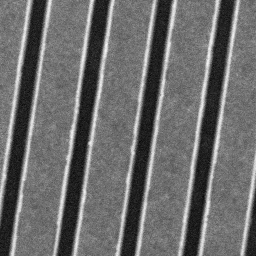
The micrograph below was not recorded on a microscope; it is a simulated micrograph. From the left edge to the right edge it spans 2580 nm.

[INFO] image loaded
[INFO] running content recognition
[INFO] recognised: parallel lines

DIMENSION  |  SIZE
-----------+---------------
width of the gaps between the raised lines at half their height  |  203 nanometres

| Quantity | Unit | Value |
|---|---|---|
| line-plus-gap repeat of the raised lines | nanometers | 624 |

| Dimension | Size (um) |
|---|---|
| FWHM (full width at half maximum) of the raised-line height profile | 0.425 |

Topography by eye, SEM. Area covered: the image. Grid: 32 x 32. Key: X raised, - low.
XXXX--XXXXX---XXXXX---XXXXX---XX
XXXX--XXXXX---XXXXX---XXXXX---XX
XXX---XXXXX---XXXXX--XXXXXX--XXX
XXX---XXXXX---XXXXX--XXXXXX--XXX
XXX---XXXXX--XXXXXX--XXXXXX--XXX
XXX--XXXXXX--XXXXXX--XXXXX---XXX
XXX--XXXXXX--XXXXX---XXXXX---XXX
XXX--XXXXX---XXXXX---XXXXX---XXX
XX---XXXXX---XXXXX---XXXXX---XXX
XX---XXXXX---XXXXX---XXXXX--XXXX
XX---XXXXX---XXXXX--XXXXXX--XXXX
XX---XXXXX--XXXXXX--XXXXX---XXXX
XX--XXXXXX--XXXXXX--XXXXX---XXXX
XX--XXXXXX--XXXXX---XXXXX---XXXX
XX--XXXXX---XXXXX---XXXXX---XXXX
X---XXXXX---XXXXX---XXXXX--XXXXX
X---XXXXX---XXXXX--XXXXXX--XXXXX
X---XXXXX--XXXXXX--XXXXXX--XXXXX
X---XXXXX--XXXXXX--XXXXX---XXXXX
X--XXXXXX--XXXXXX--XXXXX---XXXXX
X--XXXXX---XXXXX---XXXXX---XXXXX
X--XXXXX---XXXXX---XXXXX---XXXXX
X--XXXXX---XXXXX---XXXXX--XXXXXX
---XXXXX---XXXXX--XXXXXX--XXXXXX
---XXXXX--XXXXXX--XXXXXX--XXXXX-
--XXXXXX--XXXXXX--XXXXX---XXXXX-
--XXXXXX--XXXXX---XXXXX---XXXXX-
--XXXXXX--XXXXX---XXXXX---XXXXX-
--XXXXX---XXXXX---XXXXX--XXXXXX-
--XXXXX---XXXXX---XXXXX--XXXXXX-
--XXXXX---XXXXX--XXXXXX--XXXXX--
--XXXXX--XXXXXX--XXXXXX--XXXXX--